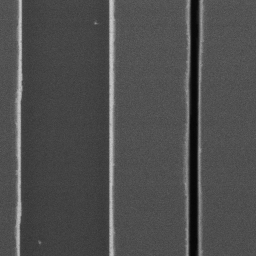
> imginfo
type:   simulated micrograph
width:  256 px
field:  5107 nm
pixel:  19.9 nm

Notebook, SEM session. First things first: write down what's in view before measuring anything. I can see lines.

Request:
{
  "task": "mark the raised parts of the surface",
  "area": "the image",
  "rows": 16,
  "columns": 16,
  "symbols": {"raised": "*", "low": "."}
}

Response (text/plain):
*......*********
*......*********
*......*********
*......*********
*......*********
*......*********
*......*********
*......*********
*......*********
*......*********
*......*********
*......*********
*......*********
*......*********
*......*********
*......*********